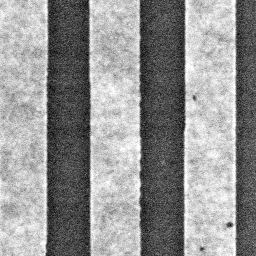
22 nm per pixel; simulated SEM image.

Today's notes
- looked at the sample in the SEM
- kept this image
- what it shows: lines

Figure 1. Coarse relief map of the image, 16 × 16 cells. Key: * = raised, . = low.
***...***...***.
***...***...***.
***...***...***.
***...***...***.
***...***...***.
***...***...***.
***...***...***.
***...***...***.
***...***...***.
***...***...***.
***...***...***.
***...***...***.
***...***...***.
***...***...***.
***...***...***.
***...***...***.